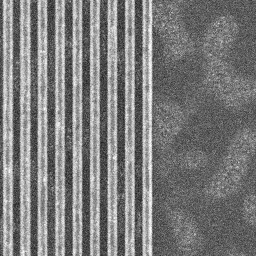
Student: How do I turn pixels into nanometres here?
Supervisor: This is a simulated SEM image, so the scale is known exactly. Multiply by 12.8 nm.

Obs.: parallel lines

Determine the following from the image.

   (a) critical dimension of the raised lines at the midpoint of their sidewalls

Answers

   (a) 86.6 nm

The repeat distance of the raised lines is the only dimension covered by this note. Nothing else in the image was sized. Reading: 17.5 px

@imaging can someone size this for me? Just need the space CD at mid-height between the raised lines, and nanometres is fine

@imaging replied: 138